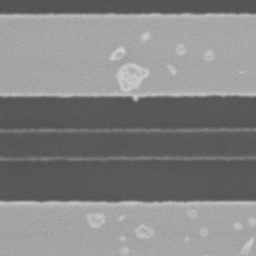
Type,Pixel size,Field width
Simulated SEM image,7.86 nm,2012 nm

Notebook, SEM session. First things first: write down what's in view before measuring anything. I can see lines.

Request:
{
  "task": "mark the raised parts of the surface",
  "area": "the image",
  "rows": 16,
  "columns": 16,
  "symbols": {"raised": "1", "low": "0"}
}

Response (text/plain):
0000000000000000
1111111111111111
1111111111111111
1111111111111111
1111111111111111
1111111111111111
0000000000000000
0000000000000000
1111111111111111
1111111111111111
0000000000000000
0000000000000000
0000000000000000
1111111111111111
1111111111111111
1111111111111111